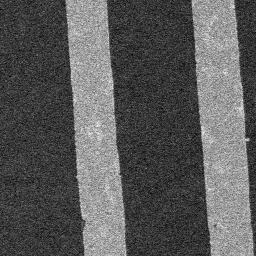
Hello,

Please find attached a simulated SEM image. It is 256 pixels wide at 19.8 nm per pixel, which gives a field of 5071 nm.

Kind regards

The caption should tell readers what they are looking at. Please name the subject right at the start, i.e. one or a few lines or trenches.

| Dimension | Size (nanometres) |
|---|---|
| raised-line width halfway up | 832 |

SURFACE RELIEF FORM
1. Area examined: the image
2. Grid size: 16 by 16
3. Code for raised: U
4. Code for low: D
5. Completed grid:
DDDDUUUDDDDDUUUD
DDDDUUUDDDDDUUUD
DDDDUUUDDDDDUUUD
DDDDUUUDDDDDUUUD
DDDDUUUDDDDDUUUD
DDDDDUUDDDDDUUUD
DDDDDUUDDDDDUUUD
DDDDDUUDDDDDDUUD
DDDDDUUDDDDDDUUD
DDDDDUUDDDDDDUUD
DDDDDUUDDDDDDUUD
DDDDDUUUDDDDDUUU
DDDDDUUUDDDDDUUU
DDDDDUUUDDDDDUUU
DDDDDUUUDDDDDUUU
DDDDDUUUDDDDDUUU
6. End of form